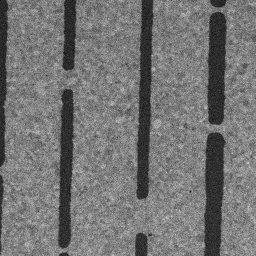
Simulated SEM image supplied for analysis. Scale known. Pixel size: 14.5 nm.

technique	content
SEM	one or a few lines or trenches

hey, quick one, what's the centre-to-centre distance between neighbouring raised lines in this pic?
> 1050 nm